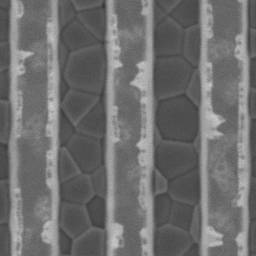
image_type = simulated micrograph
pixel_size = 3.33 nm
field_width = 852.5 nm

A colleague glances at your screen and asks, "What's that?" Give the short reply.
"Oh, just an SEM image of one or a few lines or trenches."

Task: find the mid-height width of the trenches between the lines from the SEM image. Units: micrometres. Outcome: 0.185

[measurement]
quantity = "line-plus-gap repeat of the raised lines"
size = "95.3 pixels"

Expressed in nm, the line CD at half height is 134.